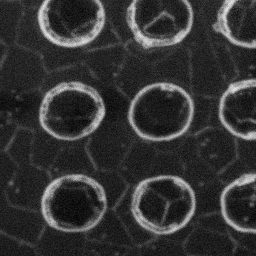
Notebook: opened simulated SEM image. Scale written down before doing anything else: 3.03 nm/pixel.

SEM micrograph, raised bodies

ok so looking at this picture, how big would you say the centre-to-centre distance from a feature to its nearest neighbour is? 89.3 pixels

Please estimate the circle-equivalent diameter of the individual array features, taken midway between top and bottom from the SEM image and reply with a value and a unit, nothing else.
0.18 um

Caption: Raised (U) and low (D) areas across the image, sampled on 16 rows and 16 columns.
DDDUUUDDUUUUDDUU
DDDUUUDDUUUUDDUU
DDDUUUDDDUUDDDDU
DDDDDDDDDDDDDDDD
DDDDDDDDDDDDDDDD
DDDUUUDDDUUDDDUU
DDDUUUDDUUUUDDUU
DDDUUUDDUUUUDDUU
DDDDUDDDDUUDDDDU
DDDDDDDDDDDDDDDD
DDDDDDDDDDDDDDDD
DDDUUUDDDUUUDDDU
DDDUUUUDUUUUDDUU
DDDUUUDDUUUUDDUU
DDDDDDDDDDDDDDDD
DDDDDDDDDDDDDDDD